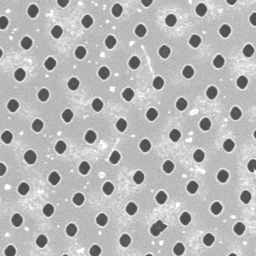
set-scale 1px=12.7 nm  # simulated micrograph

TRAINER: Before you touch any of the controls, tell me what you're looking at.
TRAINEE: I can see a regular array of holes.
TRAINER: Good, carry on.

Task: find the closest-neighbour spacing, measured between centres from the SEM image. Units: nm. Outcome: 395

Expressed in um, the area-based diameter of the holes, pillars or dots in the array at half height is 0.152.